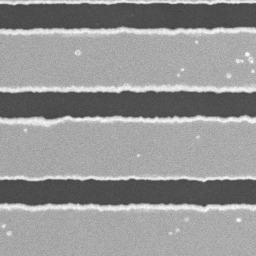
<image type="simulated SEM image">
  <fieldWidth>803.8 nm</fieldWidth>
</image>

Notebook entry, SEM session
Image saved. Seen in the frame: lines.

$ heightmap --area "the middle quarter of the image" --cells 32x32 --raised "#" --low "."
################################
################################
################################
################################
################################
################################
################################
................................
................................
................................
................................
................................
................................
##....#.#...###............##...
################################
################################
################################
################################
################################
################################
################################
################################
################################
################################
################################
################################
################################
################################
################################
................................
................................
................................